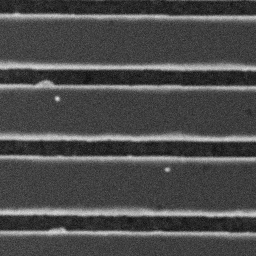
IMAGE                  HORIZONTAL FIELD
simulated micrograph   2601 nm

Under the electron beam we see lines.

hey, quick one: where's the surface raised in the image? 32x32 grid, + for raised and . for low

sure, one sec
................................
................................
++++++++++++++++++++++++++++++++
++++++++++++++++++++++++++++++++
++++++++++++++++++++++++++++++++
++++++++++++++++++++++++++++++++
++++++++++++++++++++++++++++++++
++++++++++++++++++++++++++++++++
....++++++++++++++++++++++++++++
................................
................................
++++++++++++++++++++++++++++++++
++++++++++++++++++++++++++++++++
++++++++++++++++++++++++++++++++
++++++++++++++++++++++++++++++++
++++++++++++++++++++++++++++++++
++++++++++++++++++++++++++++++++
................++......++++++++
................................
................................
++++++++++++++++++++++++++++++++
++++++++++++++++++++++++++++++++
++++++++++++++++++++++++++++++++
++++++++++++++++++++++++++++++++
++++++++++++++++++++++++++++++++
++++++++++++++++++++++++++++++++
++++++++++++++++++++++++++++++++
................................
................................
++++++++++++++++++++++++++++++++
++++++++++++++++++++++++++++++++
++++++++++++++++++++++++++++++++